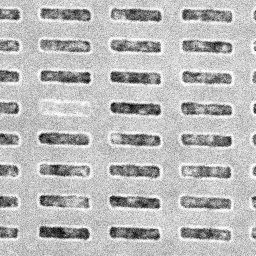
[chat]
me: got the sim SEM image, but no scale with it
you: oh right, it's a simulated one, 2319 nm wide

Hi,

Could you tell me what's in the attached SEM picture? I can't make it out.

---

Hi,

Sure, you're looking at a regular array of holes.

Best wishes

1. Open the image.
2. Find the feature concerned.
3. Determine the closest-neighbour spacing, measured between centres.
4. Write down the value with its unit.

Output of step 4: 31.1 px